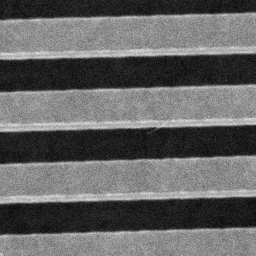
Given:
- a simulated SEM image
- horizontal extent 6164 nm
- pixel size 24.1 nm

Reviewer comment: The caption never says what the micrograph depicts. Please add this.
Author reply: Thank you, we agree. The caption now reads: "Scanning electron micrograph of lines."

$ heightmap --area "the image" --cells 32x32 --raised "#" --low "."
................................
................................
....############################
################################
################################
################################
################################
................................
................................
................................
................................
.....###########################
################################
################################
################################
##############################..
................................
................................
................................
................................
....############################
################################
################################
################################
#############################...
................................
................................
................................
................................
################################
################################
################################